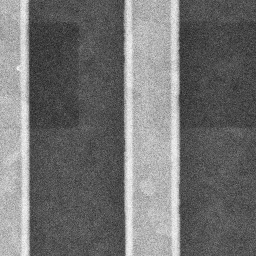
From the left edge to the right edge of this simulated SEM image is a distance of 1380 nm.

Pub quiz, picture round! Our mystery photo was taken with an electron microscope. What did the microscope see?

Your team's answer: one or a few lines or trenches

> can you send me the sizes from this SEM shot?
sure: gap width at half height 568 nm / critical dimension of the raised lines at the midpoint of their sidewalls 242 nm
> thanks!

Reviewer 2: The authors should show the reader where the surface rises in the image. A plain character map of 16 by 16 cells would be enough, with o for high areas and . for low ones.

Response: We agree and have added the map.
o.......ooo.....
o.......ooo.....
o.......ooo.....
o.......ooo.....
o.......ooo.....
o.......ooo.....
oo......ooo.....
oo......ooo.....
oo......ooo.....
oo......ooo.....
oo......ooo.....
oo......ooo.....
oo......ooo.....
oo......ooo.....
oo......ooo.....
oo......ooo.....